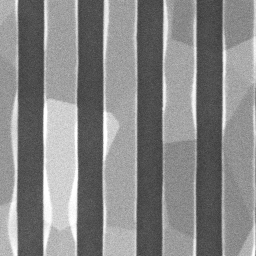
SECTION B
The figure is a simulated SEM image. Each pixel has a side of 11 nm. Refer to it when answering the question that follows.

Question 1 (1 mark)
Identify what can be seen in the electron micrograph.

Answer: wiring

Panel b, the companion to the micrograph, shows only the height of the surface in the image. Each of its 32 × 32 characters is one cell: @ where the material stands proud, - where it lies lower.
@@----@@@@---@@@@----@@@----@@@@
@@----@@@@---@@@@----@@@----@@@@
@@----@@@@---@@@@----@@@----@@@@
@@----@@@@---@@@@----@@@----@@@@
@@----@@@@---@@@@----@@@----@@@@
@@----@@@@---@@@@----@@@----@@@@
@@----@@@@---@@@@----@@@----@@@@
@@----@@@@---@@@@---@@@@----@@@@
@@----@@@@---@@@@---@@@@----@@@@
@@----@@@@---@@@@---@@@@----@@@@
@@----@@@@---@@@@----@@@----@@@@
@@----@@@@---@@@@----@@@----@@@@
@@----@@@@---@@@@----@@@----@@@@
@@----@@@@---@@@@---@@@@----@@@@
@@----@@@@---@@@@---@@@@----@@@@
@@----@@@@---@@@@---@@@@----@@@@
@@----@@@@---@@@@---@@@@----@@@@
@@----@@@----@@@@---@@@@----@@@@
@@----@@@@---@@@@---@@@@----@@@@
@@----@@@@---@@@@---@@@@----@@@@
@@----@@@@---@@@@---@@@@----@@@@
@@----@@@@---@@@@---@@@@----@@@@
@@----@@@@---@@@@---@@@@----@@@@
@@----@@@----@@@@---@@@@----@@@@
@@----@@@----@@@@---@@@@----@@@@
@@----@@@----@@@@---@@@@----@@@@
@@----@@@----@@@@---@@@@----@@@@
@@----@@@----@@@@---@@@@----@@@@
@@----@@@----@@@@---@@@@----@@@@
@@----@@@----@@@@---@@@@----@@@@
@@----@@@@---@@@@---@@@@----@@@@
@@----@@@@---@@@@---@@@@----@@@@